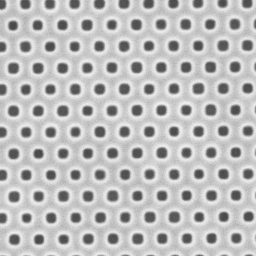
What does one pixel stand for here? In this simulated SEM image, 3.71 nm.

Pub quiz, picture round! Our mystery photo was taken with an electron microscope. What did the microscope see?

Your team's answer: a regular array of holes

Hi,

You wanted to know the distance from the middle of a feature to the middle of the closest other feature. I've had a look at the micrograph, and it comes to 0.0905 micrometres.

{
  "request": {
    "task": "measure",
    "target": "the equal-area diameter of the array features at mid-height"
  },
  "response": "43.4 nm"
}